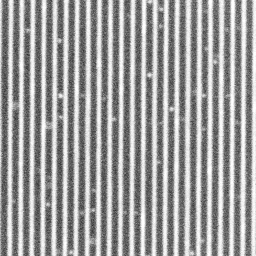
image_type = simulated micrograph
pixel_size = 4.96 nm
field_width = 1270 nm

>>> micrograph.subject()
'parallel lines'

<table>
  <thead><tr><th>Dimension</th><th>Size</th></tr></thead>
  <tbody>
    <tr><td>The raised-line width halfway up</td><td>14.9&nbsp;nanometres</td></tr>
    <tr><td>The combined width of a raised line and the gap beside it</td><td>0.0551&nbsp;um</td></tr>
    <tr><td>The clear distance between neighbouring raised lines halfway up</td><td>39.7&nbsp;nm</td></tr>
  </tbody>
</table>